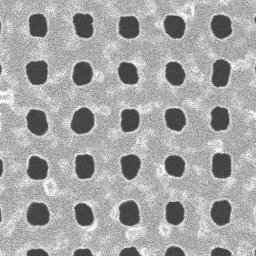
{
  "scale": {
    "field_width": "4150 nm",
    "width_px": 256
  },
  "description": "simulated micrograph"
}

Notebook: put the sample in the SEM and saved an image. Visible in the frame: a regular array of holes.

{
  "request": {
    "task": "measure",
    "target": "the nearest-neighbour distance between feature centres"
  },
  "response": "738 nanometers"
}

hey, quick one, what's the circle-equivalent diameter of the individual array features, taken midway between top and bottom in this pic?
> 372 nm